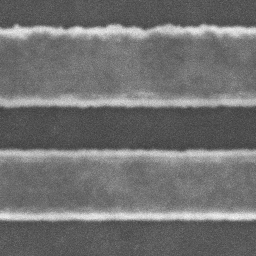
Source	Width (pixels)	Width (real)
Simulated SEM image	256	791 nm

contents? one or a few lines or trenches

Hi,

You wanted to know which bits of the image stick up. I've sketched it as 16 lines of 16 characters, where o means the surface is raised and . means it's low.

................
................
oooooooooooooooo
oooooooooooooooo
oooooooooooooooo
oooooooooooooooo
................
................
................
................
oooooooooooooooo
oooooooooooooooo
oooooooooooooooo
.ooo.o..o.o.ooo.
................
................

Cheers